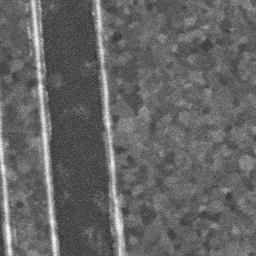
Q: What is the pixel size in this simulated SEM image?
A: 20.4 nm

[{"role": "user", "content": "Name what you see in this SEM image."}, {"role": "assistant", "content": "one or a few lines or trenches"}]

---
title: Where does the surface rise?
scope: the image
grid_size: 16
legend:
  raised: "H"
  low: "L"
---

HHLLLLHHHHHHHHHH
HHLLLLHHHHHHHHHH
HHLLLLHHHHHHHHHH
HHLLLLHHHHHHHHHH
HHLLLLHHHHHHHHHH
HHHLLLLHHHHHHHHH
HHHLLLLHHHHHHHHH
HHHLLLLHHHHHHHHH
HHHLLLLHHHHHHHHH
HHHLLLLHHHHHHHHH
HHHLLLLHHHHHHHHH
HHHLLLLHHHHHHHHH
HHHLLLLHHHHHHHHH
HHHLLLLHHHHHHHHH
LHHLLLLHHHHHHHHH
LHHLLLLLHHHHHHHH